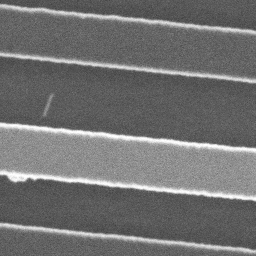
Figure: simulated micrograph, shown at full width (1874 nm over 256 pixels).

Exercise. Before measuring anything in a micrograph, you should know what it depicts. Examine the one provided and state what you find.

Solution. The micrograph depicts lines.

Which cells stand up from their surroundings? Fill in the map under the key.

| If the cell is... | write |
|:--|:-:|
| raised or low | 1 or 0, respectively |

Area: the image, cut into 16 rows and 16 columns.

1100000000000000
1111111111110000
1111111111111111
1111111111111111
0000000000111111
0000000000000000
0000000000000000
0000000000000000
1111111100000000
1111111111111111
1111111111111111
0000001111111111
0000000000000000
0000000000000000
1111100000000000
1111111111111110